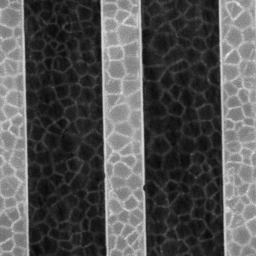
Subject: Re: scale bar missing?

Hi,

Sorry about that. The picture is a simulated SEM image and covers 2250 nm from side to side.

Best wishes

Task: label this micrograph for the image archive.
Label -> one or a few lines or trenches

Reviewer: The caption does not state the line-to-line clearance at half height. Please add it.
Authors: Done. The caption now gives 698 nm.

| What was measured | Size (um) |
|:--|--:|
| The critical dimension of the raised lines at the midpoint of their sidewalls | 0.333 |